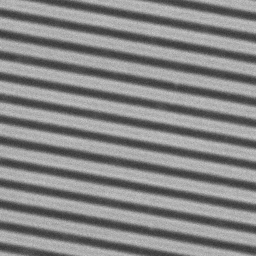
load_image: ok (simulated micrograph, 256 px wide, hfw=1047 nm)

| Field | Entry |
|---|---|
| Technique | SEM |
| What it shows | parallel lines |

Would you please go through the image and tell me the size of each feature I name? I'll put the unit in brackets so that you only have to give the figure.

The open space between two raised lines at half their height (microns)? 0.0418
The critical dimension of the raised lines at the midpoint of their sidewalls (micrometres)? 0.0453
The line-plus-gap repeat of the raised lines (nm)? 85.6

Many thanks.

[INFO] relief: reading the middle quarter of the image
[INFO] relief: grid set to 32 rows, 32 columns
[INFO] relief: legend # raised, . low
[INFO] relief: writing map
......###############...........
...........###############......
##...............##############.
########..............##########
#############..............#####
....##############..............
..........##############........
#..............##############...
######...............###########
############..............######
...##############..............#
........###############.........
..............##############....
####...............#############
##########..............########
###############...............##
......###############...........
...........###############......
##...............###############
########..............##########
#############...............####
.....##############.............
..........###############.......
#...............#############...
#######..............###########
############...............#####
...##############...............
........###############.........
..............##############....
####...............#############
##########..............########
..#############...............##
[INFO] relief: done